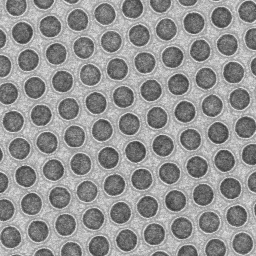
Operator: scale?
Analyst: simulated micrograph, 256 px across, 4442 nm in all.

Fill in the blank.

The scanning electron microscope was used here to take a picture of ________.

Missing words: a regular array of holes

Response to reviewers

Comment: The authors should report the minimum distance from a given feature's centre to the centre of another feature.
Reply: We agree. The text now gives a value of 485 nanometres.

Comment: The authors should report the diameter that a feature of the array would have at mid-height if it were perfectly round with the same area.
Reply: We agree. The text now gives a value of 380 nanometers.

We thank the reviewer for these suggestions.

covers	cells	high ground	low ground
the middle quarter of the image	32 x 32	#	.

#####...###.....##.....##....###
####.....##.....##....##########
..##.....##.....############..##
..##.....###...###########.....#
..###....###########....##.....#
..####.############.....##.....#
.############....##......#.....#
######...###.....##.....###...##
#.###.....##......##....########
...##......#.....############..#
....#......##...############....
....##....###########....###....
....###..######...###.....#.....
...###########.....##.....##....
########...###.....##.....###..#
##..###.....##.....##....#######
.....##.....##.....###########..
.....##.....###...###########...
.....###...############....##...
.....############..###.....##...
#...############....##......##..
#########....##......#.....####.
###..####.....#......##....#####
##....##......##....############
#......##.....###..############.
##.....##....###########....##..
##.....###########...###.....##.
###...###########.....##.....##.
###########....##.....##.....###
#####..###.....##.....###...####
###.....##.....##.....##########
.##.....##.....####.#######.####